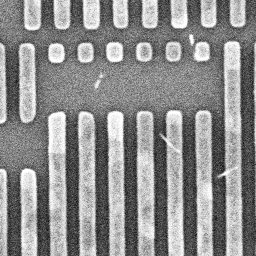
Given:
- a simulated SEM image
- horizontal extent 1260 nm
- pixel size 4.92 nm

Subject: wiring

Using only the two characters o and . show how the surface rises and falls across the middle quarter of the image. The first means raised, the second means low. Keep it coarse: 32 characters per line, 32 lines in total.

................................
................................
................................
................................
................................
................................
................................
................................
................................
................................
................................
................................
....ooo....ooo.....ooo....ooo...
....ooo....ooo.....ooo....ooo...
....ooo....ooo.....ooo....ooo...
....oooo...ooo.....ooo....ooo...
....oooo...ooo.....ooo....ooo...
....oooo...ooo.....ooo....ooo...
....oooo...ooo.....ooo...oooo...
....oooo...ooo.....ooo....ooo...
....oooo...oooo....ooo....ooo...
....oooo...oooo....ooo....ooo...
....oooo...oooo....ooo....ooo...
....oooo...oooo....ooo....ooo...
....oooo...oooo....ooo....ooo...
....oooo...oooo....ooo....ooo...
....oooo...oooo....ooo....ooo...
....oooo...oooo....ooo....ooo...
....oooo...oooo....ooo....ooo...
....oooo...oooo....ooo....ooo...
....oooo...oooo....ooo....ooo...
....oooo...oooo....ooo....ooo...